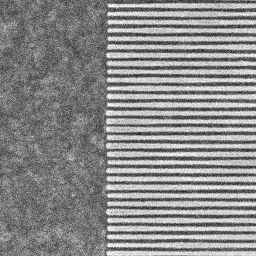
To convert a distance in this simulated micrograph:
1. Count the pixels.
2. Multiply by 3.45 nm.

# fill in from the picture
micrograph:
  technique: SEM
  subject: parallel lines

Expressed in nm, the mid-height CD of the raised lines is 14.2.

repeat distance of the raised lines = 28.4 nm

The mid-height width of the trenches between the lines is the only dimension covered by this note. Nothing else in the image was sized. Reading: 14.7 nanometers